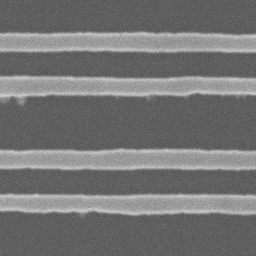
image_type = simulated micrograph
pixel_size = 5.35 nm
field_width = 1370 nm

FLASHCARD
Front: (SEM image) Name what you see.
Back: lines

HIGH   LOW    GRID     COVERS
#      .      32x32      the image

................................
................................
................................
................................
################################
################################
................................
................................
................................
................................
################################
################################
................................
................................
................................
................................
................................
................................
................................
################################
################################
................................
................................
................................
###########.....################
################################
.....#.......###################
................................
................................
................................
................................
................................